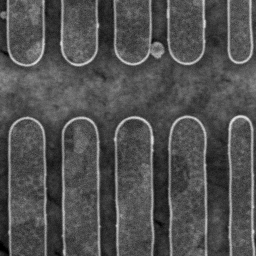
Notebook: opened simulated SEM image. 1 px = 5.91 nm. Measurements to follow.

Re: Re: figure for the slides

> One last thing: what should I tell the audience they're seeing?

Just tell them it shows groups of lines, slits or small figures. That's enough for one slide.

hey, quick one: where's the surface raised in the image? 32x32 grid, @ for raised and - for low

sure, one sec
-@@@@---@@@@--@@@@@--@@@@----@@-
-@@@@---@@@@--@@@@@--@@@@----@@-
-@@@@---@@@@--@@@@@--@@@@----@@-
-@@@@---@@@@--@@@@@--@@@@----@@-
-@@@@---@@@@--@@@@@--@@@@----@@-
-@@@@---@@@@--@@@@@@-@@@@@---@@-
-@@@@---@@@@---@@@@@-@@@@----@@-
--@@@---@@@----@@@----@@@----@@-
--------------------------------
--------------------------------
--------------------------------
--------------------------------
--------------------------------
--------------------------------
--------------------------------
--@@@---@@@@---@@@@---@@@----@@-
-@@@@---@@@@---@@@@--@@@@@---@@-
-@@@@@--@@@@---@@@@--@@@@@---@@-
-@@@@@--@@@@---@@@@--@@@@@---@@-
-@@@@@--@@@@---@@@@--@@@@@---@@-
-@@@@@--@@@@---@@@@--@@@@@---@@-
-@@@@@--@@@@---@@@@--@@@@@---@@-
-@@@@@--@@@@---@@@@--@@@@@---@@@
-@@@@@--@@@@---@@@@--@@@@@---@@@
-@@@@@--@@@@---@@@@--@@@@@---@@-
-@@@@@--@@@@---@@@@--@@@@@---@@-
-@@@@@--@@@@---@@@@--@@@@@---@@-
-@@@@@--@@@@---@@@@--@@@@@---@@-
-@@@@@--@@@@---@@@@--@@@@@---@@-
-@@@@@--@@@@---@@@@--@@@@@---@@@
-@@@@@--@@@@---@@@@--@@@@@---@@@
-@@@@@--@@@@---@@@@--@@@@@---@@@